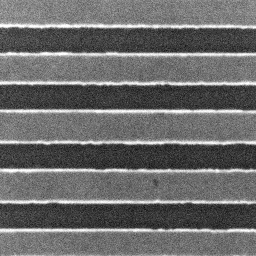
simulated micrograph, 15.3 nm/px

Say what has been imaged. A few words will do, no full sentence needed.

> lines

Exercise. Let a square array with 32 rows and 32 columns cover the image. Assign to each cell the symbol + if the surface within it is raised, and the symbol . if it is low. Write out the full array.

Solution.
++++++++++++++++++++++++++++++++
++++++++++++++++++++++++++++++++
++++++++++++++++++++++++++++++++
................................
................................
................................
................................
++++++++++++++++++++++++++++++++
++++++++++++++++++++++++++++++++
++++++++++++++++++++++++++++++++
..........+.++++.+++.+++++++++++
................................
................................
................................
++++++++++++++++++++++++++++++++
++++++++++++++++++++++++++++++++
++++++++++++++++++++++++++++++++
++++++++++++++++++++++++++++++++
................................
................................
................................
++++++++++++++++++++++++++++++++
++++++++++++++++++++++++++++++++
++++++++++++++++++++++++++++++++
++++++++++++++++++++++++++++++++
................................
................................
................................
................................
++++++++++++++++++++++++++++++++
++++++++++++++++++++++++++++++++
++++++++++++++++++++++++++++++++